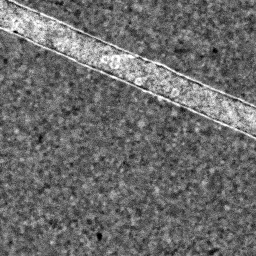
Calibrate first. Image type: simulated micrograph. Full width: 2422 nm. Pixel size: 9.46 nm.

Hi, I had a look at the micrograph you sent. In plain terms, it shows one or a few lines or trenches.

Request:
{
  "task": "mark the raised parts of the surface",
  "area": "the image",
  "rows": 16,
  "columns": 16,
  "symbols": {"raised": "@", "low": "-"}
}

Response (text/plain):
--@@@@@@@@@@@@@@
----@@@@@@@@@@@@
@@----@@@@@@@@@@
@@@@-----@@@@@@@
@@@@@@-----@@@@@
@@@@@@@@@----@@@
@@@@@@@@@@@-----
@@@@@@@@@@@@@---
@@@@@@@@@@@@@@@@
@@@@@@@@@@@@@@@@
@@@@@@@@@@@@@@@@
@@@@@@@@@@@@@@@@
@@@@@@@@@@@@@@@@
@@@@@@@@@@@@@@@@
@@@@@@@@@@@@@@@@
@@@@@@@@@@@@@@@@